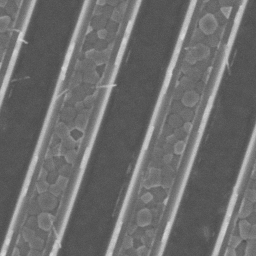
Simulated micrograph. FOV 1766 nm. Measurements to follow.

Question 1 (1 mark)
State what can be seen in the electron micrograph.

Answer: one or a few lines or trenches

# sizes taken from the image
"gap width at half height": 354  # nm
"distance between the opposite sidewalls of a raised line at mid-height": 342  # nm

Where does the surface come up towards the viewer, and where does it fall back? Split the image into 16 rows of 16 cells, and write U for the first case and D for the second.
UUDDDUUUUDDDUUUD
UUDDDUUUDDDDUUUD
UDDDDUUUDDDUUUUD
UDDDUUUUDDDUUUDD
UDDDUUUDDDDUUUDD
DDDDUUUDDDUUUUDD
DDDUUUUDDDUUUDDD
DDDUUUDDDDUUUDDD
DDDUUUDDDUUUUDDD
DDUUUUDDDUUUDDDD
DDUUUDDDDUUUDDDU
DDUUUDDDUUUUDDDU
DUUUUDDDUUUDDDDU
DUUUDDDDUUUDDDUU
DUUUDDDUUUDDDDUU
UUUUDDDUUUDDDDUU